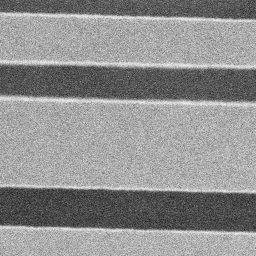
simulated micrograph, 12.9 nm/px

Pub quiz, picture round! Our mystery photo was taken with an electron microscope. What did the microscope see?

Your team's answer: lines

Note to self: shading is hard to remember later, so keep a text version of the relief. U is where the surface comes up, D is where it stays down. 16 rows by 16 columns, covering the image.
DDDDDDDDDDDDDDDD
UUUUUUUUUUUUUUUU
UUUUUUUUUUUUUUUU
UUUUUUUUUUUUUUUU
DDDDDDDDDDDDDDDD
DDDDDDDDDDDDDDDD
UUUUUUUUUUUUUDDD
UUUUUUUUUUUUUUUU
UUUUUUUUUUUUUUUU
UUUUUUUUUUUUUUUU
UUUUUUUUUUUUUUUU
UUUUUUUUUUUUUUUU
DDDDDDDDDDDDDDDD
DDDDDDDDDDDDDDDD
UUUUUUUUUUUUDDDD
UUUUUUUUUUUUUUUU